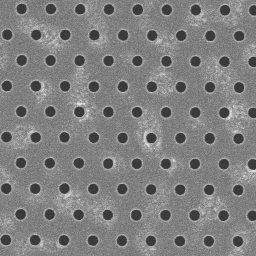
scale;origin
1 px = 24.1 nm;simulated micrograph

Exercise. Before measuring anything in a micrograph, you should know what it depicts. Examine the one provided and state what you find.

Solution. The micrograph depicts a regular array of holes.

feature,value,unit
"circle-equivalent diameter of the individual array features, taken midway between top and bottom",0.261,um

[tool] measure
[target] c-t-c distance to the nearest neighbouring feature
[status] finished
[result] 697 nm